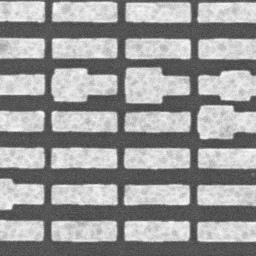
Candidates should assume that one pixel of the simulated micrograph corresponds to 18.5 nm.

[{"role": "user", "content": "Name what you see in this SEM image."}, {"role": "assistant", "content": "wiring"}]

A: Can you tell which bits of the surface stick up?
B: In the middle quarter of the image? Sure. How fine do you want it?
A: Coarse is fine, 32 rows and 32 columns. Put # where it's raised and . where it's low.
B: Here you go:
................................
#####...........########........
######..........########........
#############..################.
#############..################.
#############..################.
#############..################.
######.........###########......
######..........########........
................########........
................................
................................
#############...###############.
#############..################.
#############..################.
#############..################.
#############..################.
................................
................................
................................
................................
#############..################.
#############..################.
#############..################.
#############..################.
#############..################.
................................
................................
................................
................................
.....#####.##.............####..
#############..################.